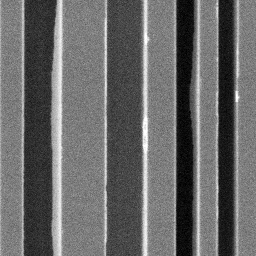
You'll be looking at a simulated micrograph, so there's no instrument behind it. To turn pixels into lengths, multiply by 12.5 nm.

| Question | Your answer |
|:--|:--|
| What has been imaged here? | lines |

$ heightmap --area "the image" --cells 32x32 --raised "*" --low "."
***....******.....****...**...**
***....******.....****...**...**
***....******.....****...**...**
***....******.....****...**...**
***....******.....****...**...**
***....******.....****...**...**
***....******.....****...**...**
***....******.....****...**...**
***....******.....****...**...**
***....******.....****..***...**
***....******.....****..***...**
***....******.....****..***...**
***....******.....****..***...**
***....******.....****..***...**
***....******.....****..***...**
***....******.....****..***...**
***....******.....****...**...**
***....******.....****...**...**
***....******.....****...**...**
***....******.....****...**...**
***....******.....****...**...**
***....******.....****...**...**
***....******.....****...**...**
***....******.....****...**...**
***....******.....****...**...**
***....******.....****...**...**
***....******.....****...**...**
***....******.....****...**...**
***....******.....****...**...**
***....******.....****...**...**
***....******.....****...**...**
***....******.....****...**...**